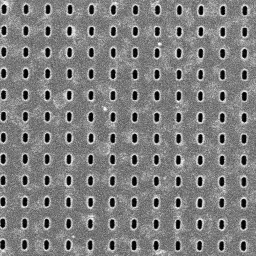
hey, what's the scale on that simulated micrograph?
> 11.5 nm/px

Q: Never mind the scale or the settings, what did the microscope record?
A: a regular array of holes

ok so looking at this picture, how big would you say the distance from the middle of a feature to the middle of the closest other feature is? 21.3 px